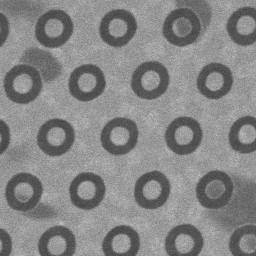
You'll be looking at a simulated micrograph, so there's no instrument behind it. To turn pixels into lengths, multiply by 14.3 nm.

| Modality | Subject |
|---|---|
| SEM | a regular array of ring-shaped grooves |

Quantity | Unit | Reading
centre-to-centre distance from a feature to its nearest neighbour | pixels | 62.5